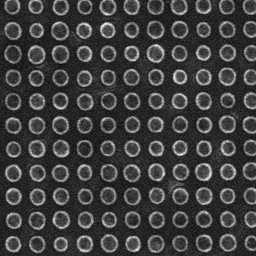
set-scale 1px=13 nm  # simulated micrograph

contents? a regular array of raised bodies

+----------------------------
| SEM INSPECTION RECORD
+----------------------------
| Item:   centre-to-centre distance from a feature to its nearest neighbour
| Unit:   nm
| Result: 302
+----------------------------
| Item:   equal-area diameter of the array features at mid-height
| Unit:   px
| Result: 15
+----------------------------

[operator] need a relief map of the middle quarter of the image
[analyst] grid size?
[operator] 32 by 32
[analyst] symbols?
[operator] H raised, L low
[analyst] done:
LLLLLLLLLLLLLLLLLLLLLLLLLLLLLLLL
LLLLLLLLLLLLLLLLHLLLLLLLLLLLLLLL
HLLLHHLLLLHHHLLHHHLLLHHHHLLLHHLL
HLLLHHHLLHHHHLLHHHHLLHHHHLLLHHHL
HLLLHHHLLLHHLLLHHHLLLLHHLLLLHHLL
LLLLLLLLLLLLLLLLLLLLLLLLLLLLLLLL
LLLLLLLLLLLLLLLLLLLLLLLLLLLLLLLL
LLLLLLLLLLLLLLLLHHLLLLLHLLLLLLLL
HLLLHHHLLHHHHLLHHHHLLHHHHLLHHHLL
HLLLHHHLLHHHHLLHHHHLLHHHHLLHHHHL
LLLLHHHLLLHHHLLHHHLLLLHHLLLLHHLL
LLLLLLLLLLLLLLLLLLLLLLLLLLLLLLLL
LLLLLLLLLLLLLLLLLLLLLLLLLLLLLLLL
LLLLLLLLLLLLLLLLHHLLLLHHLLLLHHLL
HLLLHHHLLHHHHLLLHHHLLHHHHLLHHHHL
HLLLHHHLLHHHHLLLHHHLLHHHHLLHHHHL
HLLLHHHLLLHHLLLLHHLLLLHHLLLLHHLL
LLLLLLLLLLLLLLLLLLLLLLLLLLLLLLLL
LLLLLLLLLLLLLLLLLLLLLLLLLLLLLLLL
LLLLHHLLLLHHLLLLLLLLLLHHLLLLHHLL
HLLHHHHLLHHHLLLHHHHLLLHHHLLHHHHL
HLLHHHHLLHHHHLLHHHHLLHHHHLLHHHHL
HLLLHHHLLLHHLLLLHHLLLLHHLLLLHHLL
LLLLLLLLLLLLLLLLLLLLLLLLLLLLLLLL
LLLLLLLLLLLLLLLLLLLLLLLLLLLLLLLL
LLLLHHLLLLHHLLLLHHLLLLHHLLLLHHLL
HLLLHHHLLHHHHLLHHHHLLHHHHLLHHHHL
HLLLHHHLLHHHHLLHHHHLLHHHHLLHHHHL
HLLLHHLLLLHHHLLHHHLLLLHHLLLLHHLL
LLLLLLLLLLLLLLLLLLLLLLLLLLLLLLLL
LLLLLLLLLLLLLLLLLLLLLLLLLLLLLLLL
LLLLLLLLLLHHLLLLHHLLLLHHLLLLHHLL